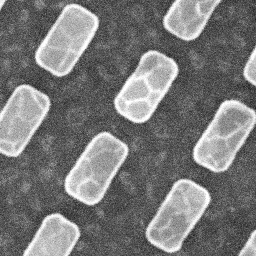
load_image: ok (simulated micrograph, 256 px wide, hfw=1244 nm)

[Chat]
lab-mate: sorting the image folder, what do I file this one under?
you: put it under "raised bodies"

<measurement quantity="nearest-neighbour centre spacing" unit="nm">453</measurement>